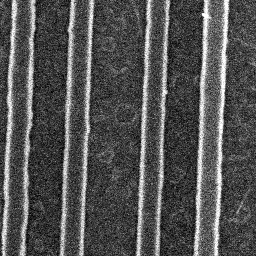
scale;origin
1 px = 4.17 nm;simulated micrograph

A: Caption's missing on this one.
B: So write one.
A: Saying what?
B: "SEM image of one or a few lines or trenches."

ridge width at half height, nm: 86.5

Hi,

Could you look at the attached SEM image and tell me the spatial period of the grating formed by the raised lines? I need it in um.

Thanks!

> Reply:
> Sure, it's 0.267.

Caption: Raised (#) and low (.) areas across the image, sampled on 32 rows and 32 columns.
..##.....##........##.....##....
..##.....##.......###.....##....
..##.....##........##.....##....
..##.....##.......###.....##....
..##.....##.......###.....##....
.###.....##.......###.....##....
.###.....##.......###....###....
.###.....##.......###....###....
.###.....##.......###....###....
.###.....##.......###....###....
.###.....##.......###....###....
.###....###.......###....###....
.###....###.......##.....###....
.###....###.......##.....###....
.###....###.......##.....###....
.###....###.......##.....###....
.###....###.......##.....###....
.###....###.......##.....###....
.###....###.......##.....###....
.##.....###.......##.....###....
.##.....###.......##.....##.....
.##.....###.......##.....##.....
.##.....###.......##.....###....
.##.....###.......##.....##.....
.##.....###.......##.....##.....
.##.....##........##.....##.....
.##.....##.......###.....##.....
.##.....##.......###.....##.....
.##.....##.......###.....##.....
###.....##.......###.....##.....
###.....##.......###.....##.....
###.....##.......###....###.....